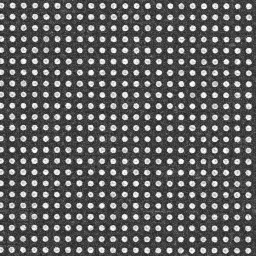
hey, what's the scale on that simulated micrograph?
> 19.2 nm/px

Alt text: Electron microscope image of a regular array of raised bodies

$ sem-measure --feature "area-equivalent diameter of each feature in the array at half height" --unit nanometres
102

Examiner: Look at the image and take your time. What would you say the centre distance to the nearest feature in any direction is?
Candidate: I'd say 206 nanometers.